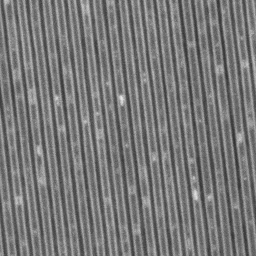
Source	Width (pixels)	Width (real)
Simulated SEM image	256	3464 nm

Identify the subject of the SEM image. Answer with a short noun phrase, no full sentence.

parallel lines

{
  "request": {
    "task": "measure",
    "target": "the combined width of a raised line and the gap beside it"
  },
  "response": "171 nanometres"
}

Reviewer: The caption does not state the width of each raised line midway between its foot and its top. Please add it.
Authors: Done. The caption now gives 106 nm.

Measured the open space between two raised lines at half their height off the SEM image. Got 4.84 pixels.